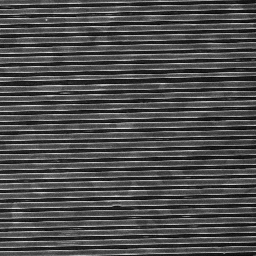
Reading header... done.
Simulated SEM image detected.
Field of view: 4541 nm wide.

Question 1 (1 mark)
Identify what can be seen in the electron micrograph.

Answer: parallel lines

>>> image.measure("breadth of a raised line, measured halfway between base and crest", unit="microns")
0.104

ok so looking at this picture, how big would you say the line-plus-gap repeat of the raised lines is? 172 nm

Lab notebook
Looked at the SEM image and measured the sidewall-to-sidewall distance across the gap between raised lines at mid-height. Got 3.87 pixels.